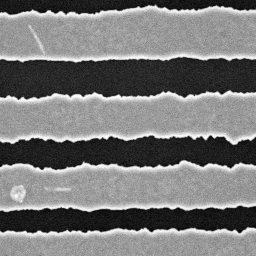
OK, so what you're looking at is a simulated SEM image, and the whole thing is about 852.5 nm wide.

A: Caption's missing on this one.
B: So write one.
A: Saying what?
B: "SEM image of lines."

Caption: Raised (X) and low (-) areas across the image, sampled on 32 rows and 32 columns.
--------------------------------
---XX-XX----XXXXXXXXXXXXXXXXXXXX
XXXXXXXXXXXXXXXXXXXXXXXXXXXXXXXX
XXXXXXXXXXXXXXXXXXXXXXXXXXXXXXXX
XXXXXXXXXXXXXXXXXXXXXXXXXXXXXXXX
XXXXXXXXXXXXXXXXXXXXXXXXXXXXXXXX
XXXXXXXXXXXXXXXXXXXXXXXXXXXXXXXX
-XXXXXXXXXXXX-------X----X------
--------------------------------
--------------------------------
--------------------------------
----------------------------X---
XXXXXXXXXXXXXXXXXXXXXXXXXXXXXXXX
XXXXXXXXXXXXXXXXXXXXXXXXXXXXXXXX
XXXXXXXXXXXXXXXXXXXXXXXXXXXXXXXX
XXXXXXXXXXXXXXXXXXXXXXXXXXXXXXXX
XXXXXXXXXXXXXXXXXXXXXXXXXXXXXXXX
XXX----XXXX----X------------XXX-
--------------------------------
--------------------------------
--X-------X-----------XX--X---X-
XXXXXXXXXXXXXXXXXXXXXXXXXXXXXXXX
XXXXXXXXXXXXXXXXXXXXXXXXXXXXXXXX
XXXXXXXXXXXXXXXXXXXXXXXXXXXXXXXX
XXXXXXXXXXXXXXXXXXXXXXXXXXXXXXXX
XXXXXXXXXXXXXXXXXXXXXXXXXXXXXXXX
--------------------------------
--------------------------------
--------------------------------
XXXXXXXXXXXXXXXXXXXXXXXXXXXXXXXX
XXXXXXXXXXXXXXXXXXXXXXXXXXXXXXXX
XXXXXXXXXXXXXXXXXXXXXXXXXXXXXXXX